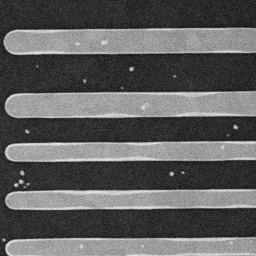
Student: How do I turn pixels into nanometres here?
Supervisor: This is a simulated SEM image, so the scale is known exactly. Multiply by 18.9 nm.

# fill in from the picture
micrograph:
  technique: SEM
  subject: groups of lines, slits or small figures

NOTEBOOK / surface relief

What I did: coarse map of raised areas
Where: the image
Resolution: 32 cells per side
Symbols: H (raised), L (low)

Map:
LLLLLLLLLLLLLLLLLLLLLLLLLLLLLLLL
LLLLLLLLLLLLLLLLLLLLLLLLLLLLLLLL
LLLLLLLLLLLLLLLLLLLLLLLLLLLLLLLL
LLLLLLLLLLLLLLLLLLLLLLLLLLLLLHHL
LHHHHHHHHHHHHHHHHHHHHHHHHHHHHHHH
LHHHHHHHHHHHHHHHHHHHHHHHHHHHHHHH
LHHHHHHHHHHHHHHHHHHHHHHHHHHLLHHH
LLLLLLLLLLLLLLLLLLLLLLLLLLLLLLLL
LLLLLLLLLLLLLLLLLLLLLLLLLLLLLLLL
LLLLLLLLLLLLLLLLLLLLLLLLLLLLLLLL
LLLLLLLLLLLLLLLLLLLLLLLLLLLLLLLL
LLLLLLLLLLLLLLLLLLLLLLLLLLLLLLLL
LHHHHHHHHHHHHHHHHHHHHHHHHHHHHHHH
LHHHHHHHHHHHHHHHHHHHHHHHHHHHHHHH
LHHHHHHHHHHHHLLLHHHHHHLLLLLLLLLL
LLLLLLLLLLLLLLLLLLLLLLLLLLLLLLLL
LLLLLLLLLLLLLLLLLLLLLLLLLLLLLLLL
LLLLLLLLLLLLLLLLLLLLLLLLLLLLLLLL
LHHHHHHHHHHHHHHHHHHHHHHHHHHHHHHH
LHHHHHHHHHHHHHHHHHHHHHHHHHHHHHHH
LLLLLLLLLLLLLLLLLLLLLLLLLLLLLLLL
LLLLLLLLLLLLLLLLLLLLLLLLLLLLLLLL
LLLLLLLLLLLLLLLLLLLLLLLLLLLLLLLL
LLLLLLLLLLLLLLLLLLLLLLLLLLLLLLLL
LHHHHHHHHHHHHHHHHHHHHHHHHHHHHHHH
LHHHHHHHHHHHHHHHHHHHHHHHHHHHHHHH
LLLLLLLLLLLLLLLLLLLLLLLLLLLLLLLL
LLLLLLLLLLLLLLLLLLLLLLLLLLLLLLLL
LLLLLLLLLLLLLLLLLLLLLLLLLLLLLLLL
LLLLLLLLLLLLLLLLLLLLLLLLLLLLLLLL
LHHHHHHHHHHHHHHHHHHHHHHHHHHHHHHH
LHHHHHHHHHHHHHHHHHHHHHHHHHHHHHHH